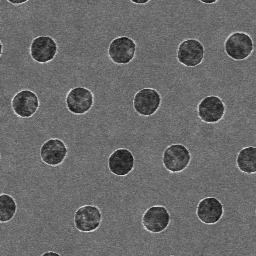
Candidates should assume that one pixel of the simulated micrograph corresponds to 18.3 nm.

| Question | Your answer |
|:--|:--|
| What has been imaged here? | a regular array of holes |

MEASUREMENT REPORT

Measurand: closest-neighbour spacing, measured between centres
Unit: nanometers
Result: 1010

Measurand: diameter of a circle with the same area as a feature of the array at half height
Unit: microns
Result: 0.482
